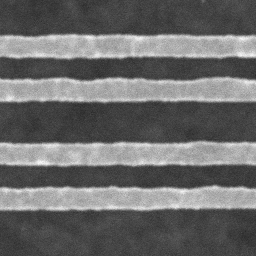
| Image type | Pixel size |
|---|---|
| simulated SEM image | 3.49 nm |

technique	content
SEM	lines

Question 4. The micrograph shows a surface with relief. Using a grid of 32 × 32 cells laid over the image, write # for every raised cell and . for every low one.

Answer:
................................
................................
................................
................................
........##......................
################################
################################
................................
................................
................................
################################
################################
####.#..###########.##..########
................................
................................
................................
................................
................................
################################
################################
##############.######.####.....#
................................
................................
.....##.#....##.#........###.##.
################################
################################
................................
................................
................................
................................
................................
................................